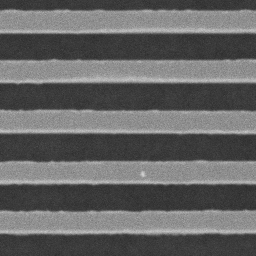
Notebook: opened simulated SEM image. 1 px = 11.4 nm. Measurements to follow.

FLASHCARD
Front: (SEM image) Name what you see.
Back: lines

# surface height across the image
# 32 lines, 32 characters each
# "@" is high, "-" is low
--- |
--------------------------------
@@@@@@@@@@@@@@@@@@@@@@@@@@@@@@@@
@@@@@@@@@@@@@@@@@@@@@@@@@@@@@@@@
@@@@@@@@@@@@@@@@@@@@@@@@@@@@@@@@
--------------------------------
--------------------------------
--------------------------------
--------------------------------
@@@@@@@@@@@@@@@@@@@@@@@@@@@@@@@@
@@@@@@@@@@@@@@@@@@@@@@@@@@@@@@@@
--------------------------------
--------------------------------
--------------------------------
--------------------------------
@@@@@@@@@@@@@@@@@@@@@@@@@@@@@@@@
@@@@@@@@@@@@@@@@@@@@@@@@@@@@@@@@
@@@@@@@@@@@@@@@@@@@@@@@@@@@@@@@@
--------------------------------
--------------------------------
--------------------------------
@@@@@@@@@@@@@@@@@@@@@@@@@@@@@@@@
@@@@@@@@@@@@@@@@@@@@@@@@@@@@@@@@
@@@@@@@@@@@@@@@@@@@@@@@@@@@@@@@@
--------------------------------
--------------------------------
--------------------------------
@@@@@@@@@--@@@@@@@@@@@@@@@@@@@@@
@@@@@@@@@@@@@@@@@@@@@@@@@@@@@@@@
@@@@@@@@@@@@@@@@@@@@@@@@@@@@@@@@
--------------------------------
--------------------------------
--------------------------------